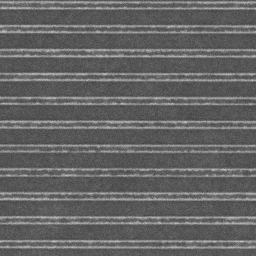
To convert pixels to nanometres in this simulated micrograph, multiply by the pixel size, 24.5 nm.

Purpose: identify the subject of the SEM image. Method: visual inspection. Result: parallel lines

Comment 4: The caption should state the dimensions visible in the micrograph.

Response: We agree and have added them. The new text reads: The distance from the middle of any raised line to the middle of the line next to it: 585 nm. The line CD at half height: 168 nm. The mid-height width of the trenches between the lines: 423 nm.